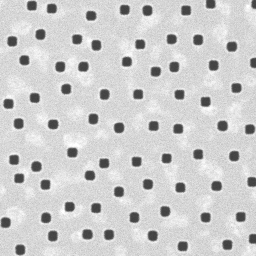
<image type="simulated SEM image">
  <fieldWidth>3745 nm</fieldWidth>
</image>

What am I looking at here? a regular array of holes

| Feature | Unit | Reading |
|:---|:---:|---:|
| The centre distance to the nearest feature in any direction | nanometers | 382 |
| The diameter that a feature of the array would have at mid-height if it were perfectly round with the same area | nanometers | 169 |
